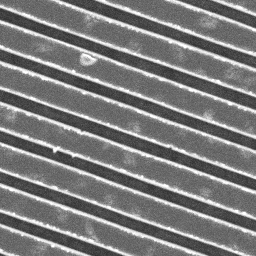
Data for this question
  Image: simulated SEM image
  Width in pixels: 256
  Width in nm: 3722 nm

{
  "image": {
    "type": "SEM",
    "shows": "parallel lines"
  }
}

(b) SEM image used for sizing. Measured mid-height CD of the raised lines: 0.376 µm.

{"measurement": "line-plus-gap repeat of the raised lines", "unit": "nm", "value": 560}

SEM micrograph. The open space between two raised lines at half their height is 0.182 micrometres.